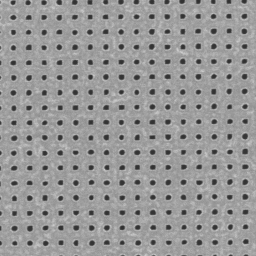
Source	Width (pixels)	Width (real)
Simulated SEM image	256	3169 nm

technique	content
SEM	a regular array of holes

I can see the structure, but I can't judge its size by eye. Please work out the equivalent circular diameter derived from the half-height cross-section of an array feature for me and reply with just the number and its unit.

69.8 nanometers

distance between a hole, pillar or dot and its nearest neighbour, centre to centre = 181 nm